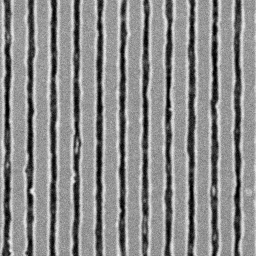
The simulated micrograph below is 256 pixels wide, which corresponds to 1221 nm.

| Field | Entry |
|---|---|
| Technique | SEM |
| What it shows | parallel lines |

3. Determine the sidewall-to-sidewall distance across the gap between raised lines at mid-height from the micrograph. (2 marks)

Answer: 35.1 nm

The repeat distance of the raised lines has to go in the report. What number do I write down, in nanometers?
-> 110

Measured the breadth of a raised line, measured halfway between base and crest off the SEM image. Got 75.1 nanometers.